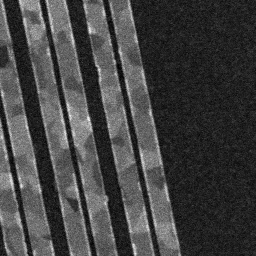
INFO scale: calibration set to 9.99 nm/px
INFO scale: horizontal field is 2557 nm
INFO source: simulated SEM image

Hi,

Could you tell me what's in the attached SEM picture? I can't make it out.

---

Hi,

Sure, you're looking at parallel lines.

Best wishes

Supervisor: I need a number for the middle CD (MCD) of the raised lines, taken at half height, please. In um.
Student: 0.2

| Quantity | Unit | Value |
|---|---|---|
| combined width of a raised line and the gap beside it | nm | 303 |